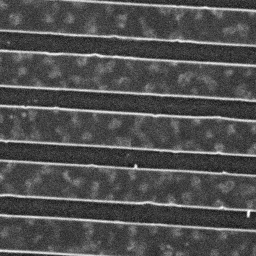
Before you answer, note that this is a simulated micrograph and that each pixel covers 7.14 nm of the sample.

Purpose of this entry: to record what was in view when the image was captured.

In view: parallel lines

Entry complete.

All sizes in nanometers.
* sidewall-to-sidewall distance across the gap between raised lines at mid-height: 136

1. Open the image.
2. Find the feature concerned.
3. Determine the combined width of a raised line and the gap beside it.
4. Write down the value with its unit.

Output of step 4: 391 nanometers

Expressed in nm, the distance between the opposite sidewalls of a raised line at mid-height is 253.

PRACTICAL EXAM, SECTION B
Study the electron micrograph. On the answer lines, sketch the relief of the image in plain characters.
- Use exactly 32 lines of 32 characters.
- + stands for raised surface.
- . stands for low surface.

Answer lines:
+++++++++++++++++...............
++++++++++++++++++++++++++++++++
++++++++++++++++++++++++++++++++
++++++++++++++++++++++++++++++++
...........+++++++++++++++++++++
............................++++
+++.............................
++++++++++++++++++++............
++++++++++++++++++++++++++++++++
++++++++++++++++++++++++++++++++
++++++++++++++++++++++++++++++++
..............++++++++++++++++++
..............................++
+++++...........................
+++++++++++++++++++++...........
++++++++++++++++++++++++++++++++
++++++++++++++++++++++++++++++++
++++++++++++++++++++++++++++++++
...............+++++++++++++++++
................................
++++++++........................
++++++++++++++++++++++++........
++++++++++++++++++++++++++++++++
++++++++++++++++++++++++++++++++
..++++++++++++++++++++++++++++++
...................+++++++++++++
................................
+++++++++++.....................
+++++++++++++++++++++++++.......
++++++++++++++++++++++++++++++++
++++++++++++++++++++++++++++++++
...+++++++++++++++++++++++++++++